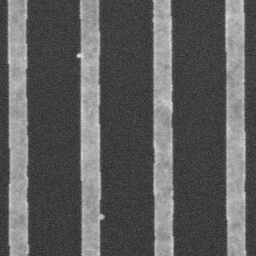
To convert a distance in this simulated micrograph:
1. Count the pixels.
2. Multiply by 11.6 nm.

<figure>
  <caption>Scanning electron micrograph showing lines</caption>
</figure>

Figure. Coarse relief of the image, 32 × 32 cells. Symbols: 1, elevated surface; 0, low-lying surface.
01100000001100000001100000001100
01100000001100000001100000001100
01100000001100000001100000001100
01100000001100000001100000001100
01100000001100000001100000001100
01100000001100000001100000001100
01100000001100000001100000001100
01100000001100000001100000001100
01100000001100000001100000001100
01100000001100000001100000001100
01100000001100000001100000001100
01100000001100000001100000001100
01100000001100000001100000001100
01100000001100000001100000001100
01100000001100000001100000001100
01100000001100000001100000001100
01100000001100000001100000001110
01100000001100000001100000001110
01100000001100000001100000001110
01100000001100000001100000001110
01100000001100000001100000001110
01100000001100000001100000001110
01100000001100000001100000001100
01100000001100000001100000001100
01100000001100000001100000001110
01100000001100000001110000001110
01100000001110000001110000001110
01100000001110000001100000001110
01100000001100000001100000000110
01100000001100000001110000000110
01110000001100000001110000000110
01110000001100000001110000000110